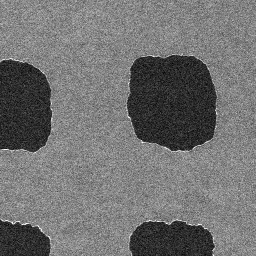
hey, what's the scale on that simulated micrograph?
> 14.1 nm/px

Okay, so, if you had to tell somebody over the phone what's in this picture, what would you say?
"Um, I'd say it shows raised bodies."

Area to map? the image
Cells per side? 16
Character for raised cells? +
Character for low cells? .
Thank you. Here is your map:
................
................
................
.........+.+....
+++.....+++++...
+++.....+++++...
+++.....++++++..
+++.....++++++..
+++......++++...
................
................
................
................
................
+++.....+++++...
+++.....+++++...